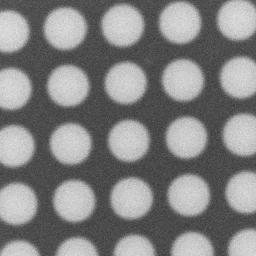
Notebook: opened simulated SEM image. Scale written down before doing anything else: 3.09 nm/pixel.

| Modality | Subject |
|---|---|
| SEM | an array of small figures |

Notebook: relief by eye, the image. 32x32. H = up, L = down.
LLLLLLLLLLLLLLLLLLLLLHHHLLLLHHHL
HHLLLLLHHHLLLHHHHLLLHHHHHLLHHHHH
HHHLLLHHHHHLLHHHHHLLHHHHHLLHHHHH
HHHHLLHHHHHLLHHHHHLLHHHHHLLHHHHH
HHHHLLHHHHHLLHHHHHLLLHHHLLLLHHHL
HHHLLLHHHHLLLLHHLLLLLLLLLLLLLLLL
HLLLLLLLLLLLLLLLLLLLLLLLLLLLLLLL
LLLLLLLLLLLLLLLLLLLLLLHLLLLLLHHL
LLLLLLLHHHLLLLHHHLLLLHHHHLLLHHHH
HHHLLLHHHHHLLHHHHHLLHHHHHLLLHHHH
HHHHLLHHHHHLLHHHHHLLHHHHHLLLHHHH
HHHHLLHHHHHLLHHHHHLLLHHHHLLLHHHH
HHHLLLLHHHLLLLHHHLLLLLHHLLLLLLLL
HHLLLLLLLLLLLLLLLLLLLLLLLLLLLLLL
LLLLLLLLLLLLLLLLLLLLLLLLLLLLLHHH
LLLLLLLLLLLLLLLHHHLLLHHHHLLLHHHH
HHHHLLLHHHHLLLHHHHLLLHHHHHLLHHHH
HHHHLLHHHHHLLLHHHHHLLHHHHHLLHHHH
HHHHLLHHHHHLLLHHHHLLLHHHHHLLLHHH
HHHHLLLHHHHLLLHHHHLLLLHHHLLLLLLL
HHHLLLLLHLLLLLLLLLLLLLLLLLLLLLLL
LLLLLLLLLLLLLLLLLLLLLLLLLLLLLLLL
LLLLLLLLLLLLLLLHHLLLLLHHHLLLLHHH
HHHHLLLHHHHLLLHHHHHLLHHHHHLLHHHH
HHHHLLLHHHHHLLHHHHHLLHHHHHLLHHHH
HHHHHLLHHHHHLLHHHHHLLHHHHHLLLHHH
HHHHLLLHHHHLLLHHHHLLLLHHHLLLLLHH
HHHHLLLLHHLLLLLLLLLLLLLLLLLLLLLL
LLLLLLLLLLLLLLLLLLLLLLLLLLLLLLLL
LLLLLLLLLLLLLLLLHHLLLLLHHLLLLHHH
LHHHLLLLHHHLLLLHHHHLLLHHHHLLLHHH
HHHHHLLHHHHHLLHHHHHLLLHHHHHLLHHH